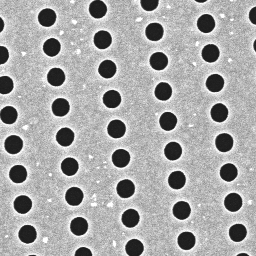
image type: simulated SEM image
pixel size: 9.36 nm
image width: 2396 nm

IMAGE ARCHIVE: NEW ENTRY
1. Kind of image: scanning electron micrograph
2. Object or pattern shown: a regular array of holes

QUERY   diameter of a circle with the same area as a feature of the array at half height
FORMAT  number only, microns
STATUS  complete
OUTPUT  0.172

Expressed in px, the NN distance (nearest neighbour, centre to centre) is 30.